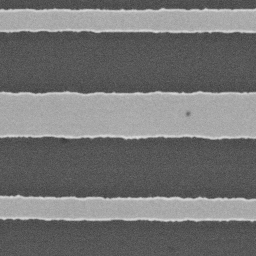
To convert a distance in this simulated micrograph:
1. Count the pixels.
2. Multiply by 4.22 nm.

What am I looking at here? lines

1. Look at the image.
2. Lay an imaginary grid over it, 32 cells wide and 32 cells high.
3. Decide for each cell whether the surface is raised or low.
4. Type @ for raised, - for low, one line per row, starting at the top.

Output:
--------------------------------
@@@@@@@@@@@@@@@@@@@@@@@@@@@@@@@@
@@@@@@@@@@@@@@@@@@@@@@@@@@@@@@@@
@@@@@@@@@@@@@@@@@@@@@@@@@@@@@@@@
--------------------------------
--------------------------------
--------------------------------
--------------------------------
--------------------------------
--------------------------------
--------------------------------
--------------------------------
@@@@@@@@@@@@@@@@@@@@@@@@@@@@@@@@
@@@@@@@@@@@@@@@@@@@@@@@@@@@@@@@@
@@@@@@@@@@@@@@@@@@@@@@@@@@@@@@@@
@@@@@@@@@@@@@@@@@@@@@@@@@@@@@@@@
@@@@@@@@@@@@@@@@@@@@@@@@@@@@@@@@
--------------------------------
--------------------------------
--------------------------------
--------------------------------
--------------------------------
--------------------------------
--------------------------------
--@-----------------------------
@@@@@@@@@@@@@@@@@@@@@@@@@@@@@@@@
@@@@@@@@@@@@@@@@@@@@@@@@@@@@@@@@
--------------------@@@-@---@--@
--------------------------------
--------------------------------
--------------------------------
--------------------------------